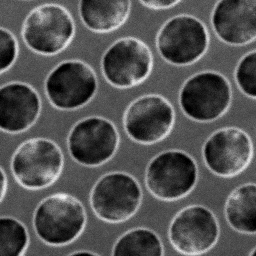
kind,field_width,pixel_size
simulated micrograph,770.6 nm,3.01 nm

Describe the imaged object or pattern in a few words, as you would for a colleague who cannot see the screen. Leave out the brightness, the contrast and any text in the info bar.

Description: a regular array of holes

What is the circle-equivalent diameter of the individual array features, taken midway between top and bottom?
142 nanometers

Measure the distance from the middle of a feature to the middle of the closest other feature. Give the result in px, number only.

59.6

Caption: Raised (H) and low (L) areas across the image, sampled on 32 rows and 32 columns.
HHHHHHHHHHLLLLLLHHLLLHHHHHHLLLLL
HHHHLLLLHHLLLLLLHHHHHHHHHHHLLLLL
HHHLLLLLLHLLLLLHHHHHHLLLLHHLLLLL
HHHLLLLLLHHLLLHHHHHHLLLLLHHLLLLL
LHHLLLLLLHHHHHHHHHHHLLLLLLHLLLLL
LLHHLLLLHHHHHHLLLLHHLLLLLLHHHLHH
LLHHHLLHHHHHHLLLLLHHLLLLLHHHHHHH
LLHHHHHHHHHHHLLLLLLHHLLLHHHHHHLL
HHHHHHHLLLLHHLLLLLHHHHHHHHHHHHLL
HHHHHHLLLLLLHLLLLLHHHHHHLLLLHHLL
HLLHHHLLLLLLHHLLHHHHHHHLLLLLLHLL
LLLLHHLLLLLLHHHHHHHHHHHLLLLLLHHL
LLLLLHLLLLLHHHHHHLLLHHHLLLLLLHHH
LLLLLHHHLHHHHHHHLLLLLHHLLLLLHHHH
LLLLLHHHHHHHHHHHLLLLLHHHLLLHHHHH
LLLLHHHHHHLLLLHHLLLLLHHHHHHHHHHH
HHHHHHHHHLLLLLHHLLLLLHHHHHHLLLHH
HHHHHHHHHLLLLLLHHLLHHHHHHHLLLLLH
HHHLLLLHHLLLLLHHHHHHHHHHHHLLLLLH
HHLLLLLLHLLLLLHHHHHHLLLHHHLLLLLH
HHLLLLLLHHHLHHHHHHHLLLLLHHLLLLLH
HHLLLLLHHHHHHHHHHHLLLLLLHHHLLHHH
HHLLLLHHHHHHHLLLLHLLLLLLHHHHHHHH
HHHHHHHHHHHHLLLLLHHLLLLLHHHHHHLL
HHHHHHHLHHHHLLLLLLHHLLHHHHHHHLLL
HHHHHLLLLLHHLLLLLHHHHHHHHHHHLLLL
HHHHHLLLLLHHLLLLLHHHHHHLLLHHLLLL
LLHHLLLLLLHHHHLHHHHHHHLLLLLHHLLL
LLLHLLLLLLHHHHHHHHHHHLLLLLLHHLLL
LLLHHLLLLHHHHHHLLLLHHLLLLLLHHHHH
LLLHHHHHHHHHHHHLLLLLHHLLLLHHHHHH
LLLHHHHHHHLHHHLLLLLLHHHLHHHHHHHH